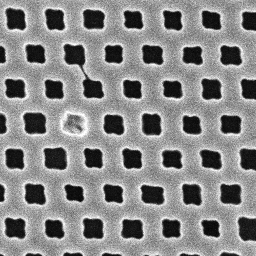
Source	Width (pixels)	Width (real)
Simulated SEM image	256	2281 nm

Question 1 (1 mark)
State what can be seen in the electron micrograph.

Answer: a regular array of holes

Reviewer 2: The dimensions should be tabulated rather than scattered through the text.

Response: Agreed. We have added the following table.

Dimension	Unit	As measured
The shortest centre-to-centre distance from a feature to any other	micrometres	0.345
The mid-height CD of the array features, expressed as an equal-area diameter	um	0.186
